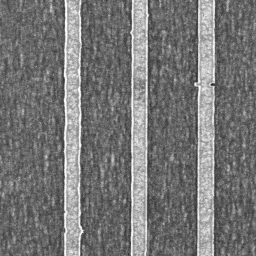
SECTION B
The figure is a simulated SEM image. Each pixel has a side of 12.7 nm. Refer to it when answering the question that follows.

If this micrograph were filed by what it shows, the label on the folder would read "one or a few lines or trenches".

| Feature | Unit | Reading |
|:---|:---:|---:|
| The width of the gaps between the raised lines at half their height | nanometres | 664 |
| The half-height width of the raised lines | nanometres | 185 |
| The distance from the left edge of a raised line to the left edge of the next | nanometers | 846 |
